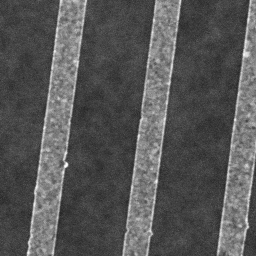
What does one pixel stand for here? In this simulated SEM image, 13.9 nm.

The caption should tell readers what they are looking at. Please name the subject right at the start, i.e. one or a few lines or trenches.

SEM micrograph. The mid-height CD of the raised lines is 342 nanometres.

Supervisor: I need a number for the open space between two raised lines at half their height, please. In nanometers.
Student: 967